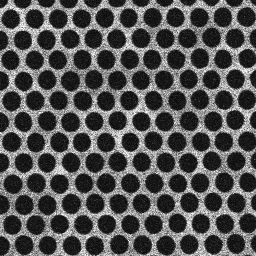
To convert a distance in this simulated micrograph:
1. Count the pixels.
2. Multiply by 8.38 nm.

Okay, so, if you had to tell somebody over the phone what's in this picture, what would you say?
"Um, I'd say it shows a regular array of holes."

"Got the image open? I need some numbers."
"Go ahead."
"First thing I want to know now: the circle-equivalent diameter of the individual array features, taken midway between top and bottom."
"160 nm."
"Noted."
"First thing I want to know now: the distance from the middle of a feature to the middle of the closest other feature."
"193 nanometres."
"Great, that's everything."